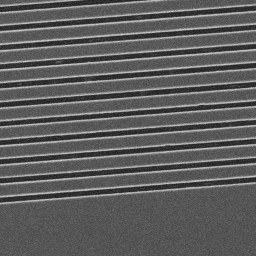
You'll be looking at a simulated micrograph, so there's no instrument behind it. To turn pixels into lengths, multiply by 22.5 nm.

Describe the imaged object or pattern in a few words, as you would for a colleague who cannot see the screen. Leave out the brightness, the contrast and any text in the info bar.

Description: parallel lines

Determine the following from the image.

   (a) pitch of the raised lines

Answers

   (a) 426 nanometres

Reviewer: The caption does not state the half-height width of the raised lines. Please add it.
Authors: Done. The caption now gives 299 nm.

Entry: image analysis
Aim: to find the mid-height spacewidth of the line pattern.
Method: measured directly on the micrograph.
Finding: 140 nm